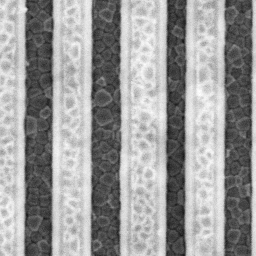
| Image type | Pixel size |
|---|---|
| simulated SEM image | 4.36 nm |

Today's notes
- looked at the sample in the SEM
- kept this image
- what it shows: one or a few lines or trenches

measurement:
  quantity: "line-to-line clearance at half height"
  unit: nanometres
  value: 152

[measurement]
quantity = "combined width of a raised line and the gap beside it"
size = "291 nanometres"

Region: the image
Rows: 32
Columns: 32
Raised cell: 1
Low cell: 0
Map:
11100001111000001111000011110000
11100001111000001111000011110000
11100001111000001111000011110000
11100001111000001111000011110000
11100001111000001111000011110000
11100001111000001111000011110000
11100001111000001111000011110000
11100001111000001111000011110000
11100001111000001111000011110000
11100001111000001111000011110000
11100001111000001111000011110000
11100001111000001111000011110000
11100001111000001111000011110000
11100001111000001111000011110000
11100001111000001111000011110000
11100001111000001111000011110000
11100001111000001111000011110000
11100001111000001111000011110000
11100001111000001111000011110000
11100001111000001111000011110000
11100001111000001111000011100000
11100001111000001111000011100000
11100001111000011111000011100000
11100001111000011111000011100000
11100001111000011111000011100000
11100001111000001111000011100000
11100001111000011111000011100000
11100001111000011111000011100000
11100001111000011111000011100000
11100001111000011111000011100000
11100001111000011111000011100000
11100001111000001111000011100000